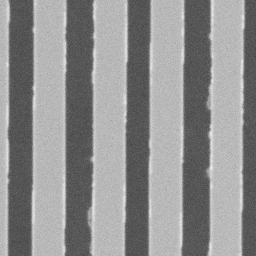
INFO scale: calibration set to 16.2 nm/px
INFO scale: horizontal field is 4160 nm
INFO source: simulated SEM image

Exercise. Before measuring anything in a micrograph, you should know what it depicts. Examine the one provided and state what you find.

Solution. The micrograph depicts lines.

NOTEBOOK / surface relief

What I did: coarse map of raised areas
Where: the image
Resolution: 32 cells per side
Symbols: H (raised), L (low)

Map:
HLLLHHHHLLLLHHHHLLLHHHHLLLHHHHLL
HLLLHHHHLLLLHHHHLLLHHHHLLLHHHHLL
HLLLHHHHLLLLHHHHLLLHHHHLLLHHHHLL
HLLLHHHHLLLLHHHHLLLHHHHLLLHHHHLL
HLLLHHHHLLLLHHHHLLLHHHHLLLHHHHLL
HLLLHHHHLLLLHHHHLLLHHHHLLLHHHHLL
HLLLHHHHLLLLHHHHLLLHHHHLLLHHHHLL
HLLLHHHHLLLLHHHHLLLHHHHLLLHHHHLL
HLLLHHHHLLLLHHHHLLLHHHHLLLHHHHLL
HLLLHHHHLLLLHHHHLLLHHHHLLLHHHHLL
HLLLHHHHLLLLHHHHLLLHHHHLLLHHHHLL
HLLLHHHHLLLLHHHHLLLHHHHLLLHHHHLL
HLLLHHHHLLLLHHHHLLLHHHHLLLHHHHLL
HLLLHHHHLLLLHHHHLLLHHHHLLLHHHHLL
HLLLHHHHLLLLHHHHLLLHHHHLLLHHHHLL
HLLLHHHHLLLLHHHHLLLHHHHLLLHHHHLL
HLLLHHHHLLLLHHHHLLLHHHHLLLHHHHLL
HLLLHHHHLLLLHHHHLLLHHHHLLLHHHHLL
HLLLHHHHLLLLHHHHLLLHHHHLLLHHHHLL
HLLLHHHHLLLLHHHHLLLHHHHLLLHHHHLL
HLLLHHHHLLLLHHHHLLLHHHHLLLHHHHLL
HLLLHHHHLLLLHHHHLLLHHHHLLLHHHHLL
HLLLHHHHLLLLHHHHLLLHHHHLLLHHHHLL
HLLLHHHHLLLLHHHHLLLHHHHLLLHHHHLL
HLLLHHHHLLLLHHHHLLLHHHHLLLHHHHLL
HLLLHHHHLLLLHHHHLLLHHHHLLLHHHHLL
HLLLHHHHLLLLHHHHLLLHHHHLLLHHHHLL
HLLLHHHHLLLLHHHHLLLHHHHLLLHHHHLL
HLLLHHHHLLLLHHHLLLLHHHHLLLHHHHLL
HLLLHHHHLLLLHHHLLLLHHHHLLLHHHHLL
HLLLHHHHLLLLHHHLLLLHHHHLLLHHHHLL
HLLLHHHHLLLLHHHLLLLHHHHLLLHHHHLL